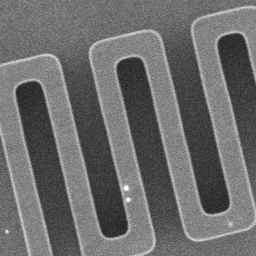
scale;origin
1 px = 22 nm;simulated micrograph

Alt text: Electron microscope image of groups of lines, slits or small figures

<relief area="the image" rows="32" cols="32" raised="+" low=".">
................................
............................++++
.........................+++++++
........................++++++++
...............+++++....++++..++
............++++++++....+++....+
...........++++++++++...+++....+
..+++++....++++...+++....++....+
++++++++...+++....+++....+++....
++++++++....+++...+++....+++....
+++..+++....+++....+++...+++....
++....++....+++....+++....++....
++....+++...+++....+++....+++...
++....+++....+++...+++....+++...
++....+++....+++....+++...+++...
+++...+++....+++....+++....++...
+++....+++...+++....+++....+++..
+++....+++....++....+++....+++..
+++....+++....+++...+++....+++..
.+++...+++....+++....+++...+++..
.+++....+++...+++....+++....+++.
.+++....+++....++....+++....+++.
.+++....+++....+++...+++....+++.
..+++...+++....+++....+++...+++.
..+++....++....+++....+++....+++
..+++....+++....++....+++....+++
..+++....+++....+++...++++..++++
...+++...+++....+++....+++++++++
...+++....++....+++....++++++++.
...+++....+++..++++....+++++....
...+++....+++++++++.............
....++....+++++++++.............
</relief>